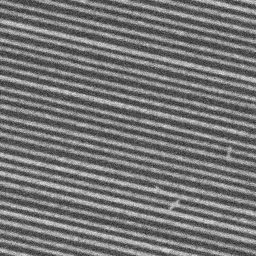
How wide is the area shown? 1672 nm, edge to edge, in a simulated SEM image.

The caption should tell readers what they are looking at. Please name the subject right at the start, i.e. parallel lines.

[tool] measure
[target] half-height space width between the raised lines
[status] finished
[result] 40.5 nanometres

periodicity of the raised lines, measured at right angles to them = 60.9 nanometers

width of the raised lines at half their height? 3.15 pixels